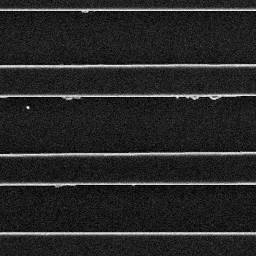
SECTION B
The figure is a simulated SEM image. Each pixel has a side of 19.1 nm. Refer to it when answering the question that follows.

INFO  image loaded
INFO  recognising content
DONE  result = lines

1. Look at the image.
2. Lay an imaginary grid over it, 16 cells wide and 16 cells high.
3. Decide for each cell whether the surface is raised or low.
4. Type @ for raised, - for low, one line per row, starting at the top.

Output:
@@@@@@@@@@@@@@@@
----------------
----------------
----------------
@@@@@@@@@@@@@@@@
@@@@@@@@@@@@@@@@
----------------
----------------
----------------
----------------
@@@@@@@@@@@@@@@@
@@@@@@@@@@@@@@@@
----------------
----------------
----------------
@@@@@@@@@@@@@@@@